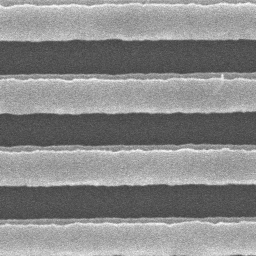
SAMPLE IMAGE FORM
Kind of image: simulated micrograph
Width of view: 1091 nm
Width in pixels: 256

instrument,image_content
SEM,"lines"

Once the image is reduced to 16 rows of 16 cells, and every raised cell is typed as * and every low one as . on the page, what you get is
****************
****************
****.*..**......
................
................
****************
****************
................
................
****************
****************
************.*..
................
................
****************
****************